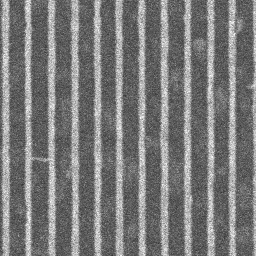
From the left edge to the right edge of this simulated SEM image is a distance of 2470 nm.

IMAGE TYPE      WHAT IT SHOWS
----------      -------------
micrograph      parallel lines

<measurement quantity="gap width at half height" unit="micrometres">0.168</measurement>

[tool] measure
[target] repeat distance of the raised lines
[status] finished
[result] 218 nm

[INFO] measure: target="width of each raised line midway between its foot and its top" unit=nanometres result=49.5